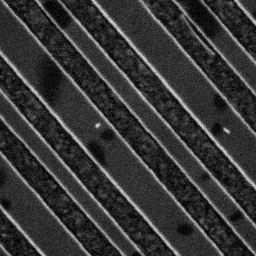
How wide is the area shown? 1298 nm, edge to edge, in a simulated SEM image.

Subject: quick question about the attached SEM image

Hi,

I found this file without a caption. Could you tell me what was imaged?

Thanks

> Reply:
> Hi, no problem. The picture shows lines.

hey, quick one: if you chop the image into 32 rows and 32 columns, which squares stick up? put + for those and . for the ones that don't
+....+++....++++++....++++....++
++....+++....++++++....++++....+
+++...++++....++++++....+++....+
++++...++++...+++++++....+++....
++++....+++....+++++++...++++...
+++++....+++....++++++....++++..
++++++....+++....++++++....++++.
.++++++....+++....++++++....++++
..++++++....+++....++++++....+++
..+++++++...++++....++++++....++
...+++++++...++++...+++++++....+
....++++++....++++...+++++++....
+....++++++....+++....++++++....
++....++++++....+++....++++++...
+++....++++++....+++....++++++..
.+++....++++++....+++....++++++.
..+++...+++++++...++++....++++++
...+++...+++++++....+++....+++++
...+++....++++++....++++...+++++
+...+++....++++++....+++....++++
+....+++....++++++....+++....+++
++....+++....++++++....+++....++
+++....+++....++++++....+++....+
++++....+++....++++++....+++....
+++++....+++....++++++...++++...
++++++....+++...++++++....++++..
+++++++...+++....++++++....+++..
.++++++....+++....++++++....+++.
..++++++....+++....++++++....+++
...++++++....+++....++++++....++
....++++++....+++....++++++....+
+....++++++....+++....++++++....